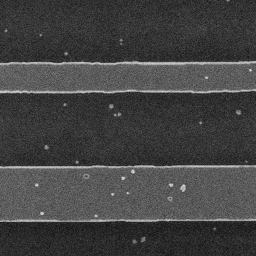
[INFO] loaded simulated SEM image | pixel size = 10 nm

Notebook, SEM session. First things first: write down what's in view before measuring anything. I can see lines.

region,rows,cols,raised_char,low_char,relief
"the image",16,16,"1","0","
0000000000000000
0000000000000000
0000000000000000
0000000000000000
1111111111111111
1111111111111111
0000000000000000
0000000000000000
0000000000000000
0000000000000000
1111111111111111
1111111111111111
1111111111111111
1111111111111111
0000000000000000
0000000000000000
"